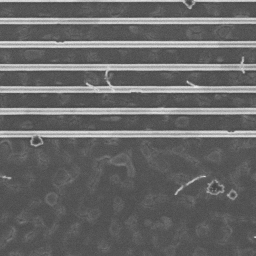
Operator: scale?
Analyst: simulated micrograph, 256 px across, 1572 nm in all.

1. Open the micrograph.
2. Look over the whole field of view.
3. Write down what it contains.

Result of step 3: parallel lines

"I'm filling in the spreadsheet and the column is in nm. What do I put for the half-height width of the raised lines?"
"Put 28.4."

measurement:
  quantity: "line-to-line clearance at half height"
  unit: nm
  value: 109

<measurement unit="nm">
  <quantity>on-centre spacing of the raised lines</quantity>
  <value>139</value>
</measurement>